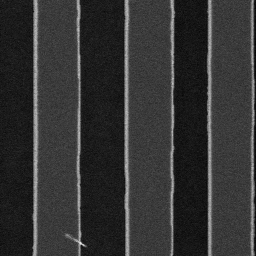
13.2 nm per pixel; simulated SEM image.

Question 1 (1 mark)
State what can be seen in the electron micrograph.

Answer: lines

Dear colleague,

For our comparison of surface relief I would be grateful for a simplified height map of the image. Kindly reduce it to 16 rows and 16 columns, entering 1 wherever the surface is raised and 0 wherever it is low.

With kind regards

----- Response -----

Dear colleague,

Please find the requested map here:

0011100011100111
0011100011100111
0011100011100111
0011100011100111
0011100011100111
0011100011100111
0011100011100111
0011100011100111
0011100011100111
0011100011100111
0011100011100111
0011100011100111
0011100011100111
0011100011100111
0011100011100111
0011100011100111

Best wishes